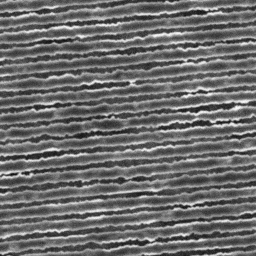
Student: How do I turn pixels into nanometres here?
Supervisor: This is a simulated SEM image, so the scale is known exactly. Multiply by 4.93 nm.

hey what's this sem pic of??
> parallel lines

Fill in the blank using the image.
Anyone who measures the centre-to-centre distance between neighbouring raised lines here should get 16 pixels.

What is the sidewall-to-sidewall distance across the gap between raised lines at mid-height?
25.1 nanometers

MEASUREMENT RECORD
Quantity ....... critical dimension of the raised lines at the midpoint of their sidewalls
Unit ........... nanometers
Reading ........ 55.2